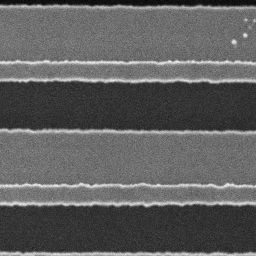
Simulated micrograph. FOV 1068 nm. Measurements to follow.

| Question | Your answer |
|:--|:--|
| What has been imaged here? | lines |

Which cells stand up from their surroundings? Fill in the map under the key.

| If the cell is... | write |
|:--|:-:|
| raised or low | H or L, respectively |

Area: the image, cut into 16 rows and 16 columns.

HHHHHHHHHHHHHHHH
HHHHHHHHHHHHHHHH
HHHHHHHHHHHHHHHH
HHHHHHHHHHHHHHHH
HHHHHHHHHHHHHHHH
LLLLLLLLLLLLLLLL
LLLLLLLLLLLLLLLL
LLLLLLLLLLLLLLLL
HHHHHHHHHHHHHHHH
HHHHHHHHHHHHHHHH
HHHHHHHHHHHHHHHH
HHHHHHHHHHHHHHHH
HHHHHHHHHHHHHHHH
LLLLLLLLLLLLLLLL
LLLLLLLLLLLLLLLL
LLLLLLLLLLLLLLLL